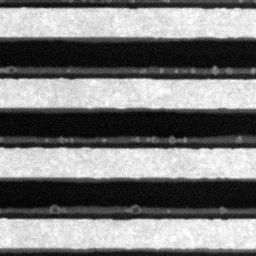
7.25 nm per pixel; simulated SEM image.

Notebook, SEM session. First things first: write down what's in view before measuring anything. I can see lines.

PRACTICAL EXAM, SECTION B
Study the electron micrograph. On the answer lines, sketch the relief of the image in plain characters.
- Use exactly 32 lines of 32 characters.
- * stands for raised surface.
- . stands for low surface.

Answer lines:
................................
********************************
********************************
********************************
********************************
................................
................................
................................
................................
................................
********************************
********************************
********************************
................................
................................
................................
................................
................................
................................
********************************
********************************
********************************
................................
................................
................................
................................
................................
**************..****************
********************************
********************************
********************************
................................